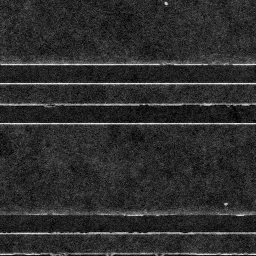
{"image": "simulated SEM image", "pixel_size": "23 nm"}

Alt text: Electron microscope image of lines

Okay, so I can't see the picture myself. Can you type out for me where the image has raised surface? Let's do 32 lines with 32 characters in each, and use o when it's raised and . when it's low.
oooooooooooooooooooooooooooooooo
oooooooooooooooooooooooooooooooo
oooooooooooooooooooooooooooooooo
oooooooooooooooooooooooooooooooo
oooooooooooooooooooooooooooooooo
oooooooooooooooooooooooooooooooo
oooooooooooooooooooooooooooooooo
oooooooooooooooooooooooooooooooo
................................
................................
................................
oooooooooooooooooooooooooooooooo
oooooooooooooooooooooooooooooooo
................................
................................
................................
oooooooooooooooooooooooooooooooo
oooooooooooooooooooooooooooooooo
oooooooooooooooooooooooooooooooo
oooooooooooooooooooooooooooooooo
oooooooooooooooooooooooooooooooo
oooooooooooooooooooooooooooooooo
oooooooooooooooooooooooooooooooo
oooooooooooooooooooooooooooooooo
oooooooooooooooooooooooooooooooo
oooooooooooooooooooooooooooooooo
...ooo.o....oooooooooo.....ooooo
................................
................................
oooooooooooooooooooooooooooooooo
oooooooooooooooooooooooooooooooo
oooooooooooooooooooooooooooooooo